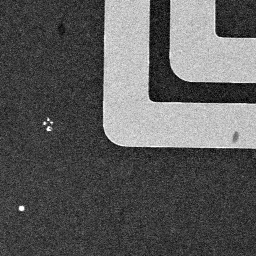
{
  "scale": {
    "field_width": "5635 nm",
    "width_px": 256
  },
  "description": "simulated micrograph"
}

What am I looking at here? groups of lines, slits or small figures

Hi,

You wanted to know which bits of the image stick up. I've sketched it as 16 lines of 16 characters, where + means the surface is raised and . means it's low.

.......++..++...
.......++..++...
.......++..+++++
.......++..+++++
.......++..+++++
......+++.......
......++++++++++
......++++++++++
.......+++++++++
................
................
................
................
................
................
................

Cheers